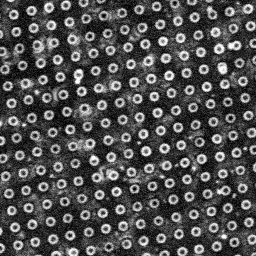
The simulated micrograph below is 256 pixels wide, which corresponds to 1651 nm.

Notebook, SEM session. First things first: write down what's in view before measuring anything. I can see a regular array of raised bodies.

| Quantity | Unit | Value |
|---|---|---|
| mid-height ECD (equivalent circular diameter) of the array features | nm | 54.5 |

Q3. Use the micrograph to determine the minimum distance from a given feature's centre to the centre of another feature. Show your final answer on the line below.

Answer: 17.1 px